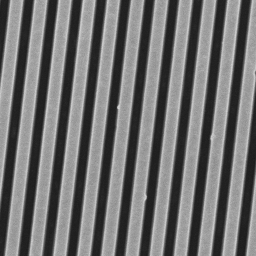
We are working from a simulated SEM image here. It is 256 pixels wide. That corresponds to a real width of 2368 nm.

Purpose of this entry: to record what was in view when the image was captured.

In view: parallel lines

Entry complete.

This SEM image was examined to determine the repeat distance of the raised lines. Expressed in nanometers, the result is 222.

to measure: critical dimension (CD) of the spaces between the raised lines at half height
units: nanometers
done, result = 95.3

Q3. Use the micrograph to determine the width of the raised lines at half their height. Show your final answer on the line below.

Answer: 0.128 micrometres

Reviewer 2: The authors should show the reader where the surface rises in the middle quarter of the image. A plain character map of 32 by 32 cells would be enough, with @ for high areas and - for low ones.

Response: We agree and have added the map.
---@@@---@@@---@@@---@@@---@@@--
---@@@---@@@---@@@---@@@---@@@--
--@@@@---@@@---@@@---@@@---@@@--
--@@@@--@@@@--@@@@---@@@---@@@--
--@@@@--@@@@--@@@@--@@@@--@@@@--
--@@@---@@@---@@@@--@@@@--@@@@--
--@@@---@@@---@@@---@@@---@@@@--
--@@@---@@@---@@@---@@@---@@@---
--@@@---@@@---@@@---@@@---@@@---
--@@@---@@@---@@@---@@@---@@@---
--@@@---@@@--@@@@---@@@---@@@---
-@@@@--@@@@--@@@@---@@@---@@@---
-@@@@--@@@@--@@@@--@@@@---@@@---
-@@@---@@@@--@@@@--@@@@--@@@@--@
-@@@---@@@---@@@---@@@@--@@@@--@
-@@@---@@@---@@@---@@@---@@@---@
-@@@---@@@---@@@---@@@---@@@---@
-@@@---@@@---@@@---@@@---@@@---@
-@@@---@@@---@@@---@@@---@@@---@
-@@@---@@@---@@@---@@@---@@@---@
@@@@--@@@@--@@@@---@@@---@@@---@
@@@@--@@@@--@@@@--@@@@--@@@@---@
@@@---@@@@--@@@@--@@@@--@@@@--@@
@@@---@@@---@@@---@@@@--@@@@--@@
@@@---@@@---@@@---@@@---@@@---@@
@@@---@@@---@@@---@@@---@@@---@@
@@@---@@@---@@@---@@@---@@@---@@
@@@---@@@---@@@---@@@---@@@---@@
@@@---@@@---@@@---@@@---@@@---@@
@@@--@@@@--@@@@---@@@---@@@---@@
@@@--@@@@--@@@@--@@@@--@@@@---@@
@@---@@@---@@@@--@@@@--@@@@--@@@